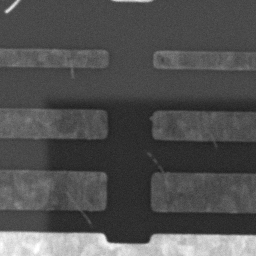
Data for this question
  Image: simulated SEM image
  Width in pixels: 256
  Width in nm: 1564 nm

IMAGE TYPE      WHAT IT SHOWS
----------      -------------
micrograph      groups of lines, slits or small figures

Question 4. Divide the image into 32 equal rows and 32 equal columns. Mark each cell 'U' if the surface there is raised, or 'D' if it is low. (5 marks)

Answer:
DDDDDDDDDDDDDDDDDDDDDDDDDDDDDDDD
DDDDDDDDDDDDDDDDDDDDDDDDDDDDDDDD
DDDDDDDDDDDDDDDDDDDDDDDDDDDDDDDD
DDDDDDDDDDDDDDDDDDDDDDDDDDDDDDDD
DDDDDDDDDDDDDDDDDDDDDDDDDDDDDDDD
DDDDDDDDDDDDDDDDDDDDDDDDDDDDDDDD
UUUUUUUUUUUUUDDDDDDDDDDDDDDDDDDD
UUUUUUUUUUUUUDDDDDDUDUUUUUUUUUUU
DDDDDDDDDDDDDDDDDDDDDDDDDUUUUUUU
DDDDDDDDDDDDDDDDDDDDDDDDDDDDDDDD
DDDDDDDDDDDDDDDDDDDDDDDDDDDDDDDD
DDDDDDDDDDDDDDDDDDDDDDDDDDDDDDDD
DDDDDDDDDDDDDDDDDDDDDDDDDDDDDDDD
DDDDDDDDDDDDDDDDDDDDDDDDDDDDDDDD
DUUUUUUUUUUUUDDDDDDUUUUUUUUUUUUU
UUUUUUUUUUUUUDDDDDDUUUUUUUUUUUUU
UUUUUUUUUUUUUDDDDDDUUUUUUUUUUUUU
DDDDDDDDDDDDDDDDDDDDDDDDUUUUDUUU
DDDDDDDDDDDDDDDDDDDDDDDDDDDDDDDD
DDDDDDDDDDDDDDDDDDDDDDDDDDDDDDDD
DDDDDDDDDDDDDDDDDDDDDDDDDDDDDDDD
UDUUUUUUUUDDDDDDDDDDDDDDDDDDDDDD
UDUUUUUUUUUUUDDDDDDUUUUUUUUUUUUU
UUUUUUUUUUUUUDDDDDDUUUUUUUUUUUUU
UUUUUUUUUUUUUDDDDDDUUUUUUUUUUUUU
UUUUUUUUUUUUUDDDDDDUUUUUUUUUUUUU
DDDDDDDDDDDDDDDDDDDDDDDDDDDUUUUU
DDDDDDDDDDDDDDDDDDDDDDDDDDDDDDDD
DDDDDDDDDDDDDDDDDDDDDDDDDDDDDDDD
UUUUUUUUUUUUUDDDDDDUUDUDUUUUUUUU
UUUUUUUUUUUUUUDDDDUUUUUUUUUUUUUU
UUUUUUUUUUUUUUUUUUUUUUUUUUUUUUUU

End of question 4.